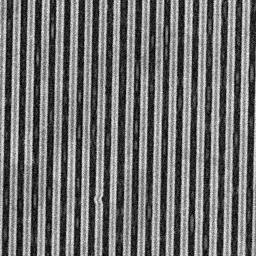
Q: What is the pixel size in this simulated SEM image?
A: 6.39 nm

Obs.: parallel lines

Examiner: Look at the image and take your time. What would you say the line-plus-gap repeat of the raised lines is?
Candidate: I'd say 0.0915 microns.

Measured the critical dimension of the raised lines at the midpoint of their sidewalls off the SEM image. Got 37.5 nanometers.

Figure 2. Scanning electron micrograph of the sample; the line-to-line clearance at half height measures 0.0535 micrometres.